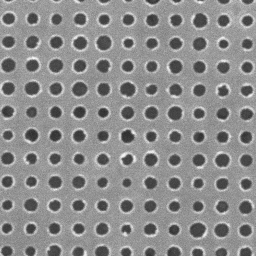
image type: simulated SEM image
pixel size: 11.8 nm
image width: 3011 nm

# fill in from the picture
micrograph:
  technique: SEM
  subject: a regular array of holes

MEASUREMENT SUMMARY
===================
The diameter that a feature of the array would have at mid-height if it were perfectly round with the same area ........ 151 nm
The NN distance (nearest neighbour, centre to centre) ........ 0.271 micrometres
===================